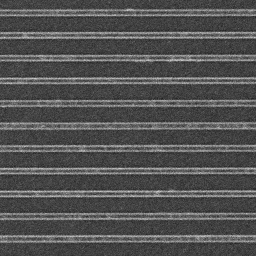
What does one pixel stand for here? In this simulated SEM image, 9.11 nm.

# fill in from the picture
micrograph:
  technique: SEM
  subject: parallel lines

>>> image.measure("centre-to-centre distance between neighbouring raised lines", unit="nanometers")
206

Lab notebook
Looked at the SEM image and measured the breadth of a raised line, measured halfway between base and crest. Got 50.1 nm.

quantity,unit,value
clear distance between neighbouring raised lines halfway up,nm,157